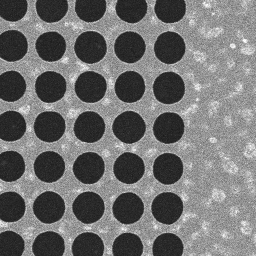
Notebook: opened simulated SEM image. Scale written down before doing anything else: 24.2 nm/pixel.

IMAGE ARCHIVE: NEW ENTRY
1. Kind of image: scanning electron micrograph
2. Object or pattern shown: a regular array of holes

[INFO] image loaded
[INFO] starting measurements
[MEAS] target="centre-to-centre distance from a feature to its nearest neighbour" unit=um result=0.953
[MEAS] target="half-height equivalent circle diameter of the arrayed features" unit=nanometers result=776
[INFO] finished